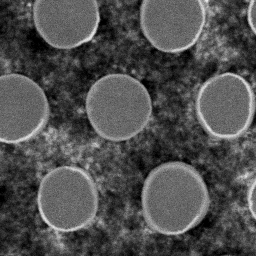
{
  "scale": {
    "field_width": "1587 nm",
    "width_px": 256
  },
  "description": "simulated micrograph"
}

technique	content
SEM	raised bodies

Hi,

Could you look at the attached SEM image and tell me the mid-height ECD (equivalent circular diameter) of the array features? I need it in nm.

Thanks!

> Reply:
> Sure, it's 400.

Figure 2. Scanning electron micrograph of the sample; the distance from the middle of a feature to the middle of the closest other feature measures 658 nm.